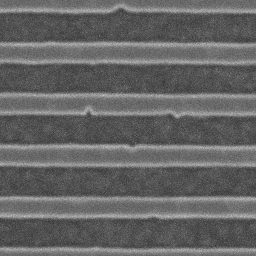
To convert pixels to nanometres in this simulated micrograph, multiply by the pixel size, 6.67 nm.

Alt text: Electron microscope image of parallel lines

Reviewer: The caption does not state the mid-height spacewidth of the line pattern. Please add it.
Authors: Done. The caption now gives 0.21 microns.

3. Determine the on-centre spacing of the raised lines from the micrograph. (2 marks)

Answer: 343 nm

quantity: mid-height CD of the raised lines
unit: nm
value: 132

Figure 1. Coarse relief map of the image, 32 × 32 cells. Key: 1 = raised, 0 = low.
11111111111111111111111111111111
00000000110000000000000000000000
00000000000000000000000000000000
00000000000000000000000000000000
00000000000000000000000000000000
11111111111111111111111100000000
11111111111111111111111111111111
11111111111111111111111111111111
00000000000000000000000000000000
00000000000000000000000000000000
00000000000000000000000000000000
00000000000000000000000000000000
11111111111111111111111111111111
11111111111111111111111111111111
00000000000000000000000000000000
00000000000000000000000000000000
00000000000000000000000000000000
00000000000000000000000000000000
11111111111111111111111111111111
11111111111111111111111111111111
11111111111111111111111111111111
00000000000000000000000000000000
00000000000000000000000000000000
00000000000000000000000000000000
00000000000000000000000000000000
11111111111111111111111111111111
11111111111111111111111111111111
00000000000000000000000000000000
00000000000000000000000000000000
00000000000000000000000000000000
00000000000000000000000000000000
11111111111111111111111111111111